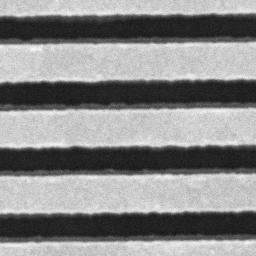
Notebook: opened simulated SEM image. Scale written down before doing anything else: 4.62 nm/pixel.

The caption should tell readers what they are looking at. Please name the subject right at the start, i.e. lines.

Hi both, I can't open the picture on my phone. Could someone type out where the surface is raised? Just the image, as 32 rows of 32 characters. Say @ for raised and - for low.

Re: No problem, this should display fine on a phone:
@@@@@@@@@@@@@@@@@@@@@@@@@@@@@@@@
@@@@@@@@@@@@@@@@@@@@@@@@@@@@@@@@
--------------------------------
--------------------------------
--------------------------------
@@@@@@@@@@@@@@@@@@@@@@@@@@@@@@@@
@@@@@@@@@@@@@@@@@@@@@@@@@@@@@@@@
@@@@@@@@@@@@@@@@@@@@@@@@@@@@@@@@
@@@@@@@@@@@@@@@@@@@@@@@@@@@@@@@@
@@@@@@@@@@@@@@@@@@@@@@@@@@@@@@@@
--------------------------------
--------------------------------
--------------------------------
@@@@@@@@@@@@@@@@@@@@@@@@@@@@@@@@
@@@@@@@@@@@@@@@@@@@@@@@@@@@@@@@@
@@@@@@@@@@@@@@@@@@@@@@@@@@@@@@@@
@@@@@@@@@@@@@@@@@@@@@@@@@@@@@@@@
@@@@@@@@@@@@@@@@@@@@@@@@@@@@@@@@
--------------------------------
--------------------------------
--------------------------------
@@@@@@@@@@@@@@@@@@@@@@@@@@@@@@@@
@@@@@@@@@@@@@@@@@@@@@@@@@@@@@@@@
@@@@@@@@@@@@@@@@@@@@@@@@@@@@@@@@
@@@@@@@@@@@@@@@@@@@@@@@@@@@@@@@@
@@@@@@@@@@@@@@@@@@@@@@@@@@@@@@@@
@@@@@@@@@@@@@@@@@-@-@@@---------
--------------------------------
--------------------------------
------------------@@--@@@@-@@@@@
@@@@@@@@@@@@@@@@@@@@@@@@@@@@@@@@
@@@@@@@@@@@@@@@@@@@@@@@@@@@@@@@@